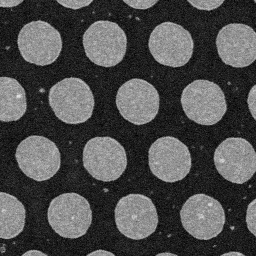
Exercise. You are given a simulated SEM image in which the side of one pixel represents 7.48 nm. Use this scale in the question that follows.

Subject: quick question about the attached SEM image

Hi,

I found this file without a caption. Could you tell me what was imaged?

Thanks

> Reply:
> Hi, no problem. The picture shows a regular array of raised bodies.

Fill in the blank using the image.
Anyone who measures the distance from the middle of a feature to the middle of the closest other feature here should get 0.491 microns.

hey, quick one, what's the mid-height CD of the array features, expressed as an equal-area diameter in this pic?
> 330 nanometres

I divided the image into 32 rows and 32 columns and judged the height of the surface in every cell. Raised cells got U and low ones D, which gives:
UUDDDDDDUUUDDDDDUUUDDDDDUUUDDDDD
DDDDDDDDDDDDDDDDDDDDDDDDDDDDDDDD
DDDDDDDDDDDDDDDDDDDDDDDDDDDDDDDD
DDDUUUUDDDDUUUUDDDDDUUUDDDDDUUUD
DDUUUUUDDDDUUUUUDDDUUUUUDDDUUUUU
DDUUUUUUDDUUUUUUDDDUUUUUDDDUUUUU
DDDUUUUDDDDUUUUUDDDUUUUUDDDUUUUU
DDDUUUUDDDDUUUUDDDDDUUUUDDDDUUUU
DDDDDDDDDDDDDDDDDDDDDDDDDDDDDDDD
DDDDDDDDDDDDDDDDDDDDDDDDDDDDDDDD
UUDDDDDUUUUDDDDUUUUDDDDDUUUDDDDD
UUUDDDUUUUUDDDDUUUUUDDDUUUUUDDDU
UUUDDDUUUUUUDDDUUUUUDDDUUUUUDDDU
UUUDDDDUUUUUDDDUUUUUDDDUUUUUDDDU
UUUDDDDUUUUDDDDUUUUDDDDUUUUUDDDD
DDDDDDDDDDDDDDDDDDDDDDDDDUUDDDDD
DDDDDDDDDDDDDDDDDDDDDDDDDDDDDDDD
DDDUUUDDDDDUUUDDDDDDUUDDDDDDUUUD
DDUUUUUDDDDUUUUDDDDUUUUDDDDUUUUU
DDUUUUUDDDUUUUUUDDDUUUUUDDDUUUUU
DDUUUUUDDDDUUUUUDDDUUUUUDDDUUUUU
DDDUUUUDDDDUUUUDDDDUUUUUDDDUUUUU
DDDDDUDDDDDDDUDDDDDDDUDDDDDDDUUD
DDDDDDDDDDDDDDDDDDDDDDDDDDDDDDDD
UDDDDDDUUUDDDDDDUUDDDDDDDUDDDDDD
UUUDDDUUUUUDDDDUUUUDDDDUUUUDDDDU
UUUDDDUUUUUDDDUUUUUUDDDUUUUUDDDU
UUUDDDUUUUUDDDUUUUUUDDDUUUUUDDDU
UUUDDDDUUUUDDDDUUUUDDDDUUUUUDDDU
UUDDDDDDUUDDDDDDUUDDDDDDUUUDDDDD
DDDDDDDDDDDDDDDDDDDDDDDDDDDDDDDD
DDDUUDDDDDDDUDDDDDDDDDDDDDDDDDDD